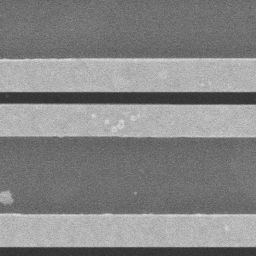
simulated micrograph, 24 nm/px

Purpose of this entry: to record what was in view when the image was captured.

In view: lines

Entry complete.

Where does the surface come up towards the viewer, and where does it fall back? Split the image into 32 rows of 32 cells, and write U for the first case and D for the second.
DDDDDDDDDDDDDDDDDDDDDDDDDDDDDDDD
DDDDDDDDDDDDDDDDDDDDDDDDDDDDDDDD
DDDDDDDDDDDDDDDDDDDDDDDDDDDDDDDD
DDDDDDDDDDDDDDDDDDDDDDDDDDDDDDDD
DDDDDDDDDDDDDDDDDDDDDDDDDDDDDDDD
DDDDDDDDDDDDDDDDDDDDDDDDDDDDDDDD
DDDDDDDDDDDDDDDDDDDDDDDDDDDDDDDD
DDDDUUUDUUUUUUUUUUUUUUUUUUUUUUUU
UUUUUUUUUUUUUUUUUUUUUUUUUUUUUUUU
UUUUUUUUUUUUUUUUUUUUUUUUUUUUUUUU
UUUUUUUUUUUUUUUUUUUUUUUUUUUUUUUU
DDDDDDDDDDDDDDDDDDDDDDDDDDDDDDDD
DDDDDDDDDDDDDDDDDDDDDDDDDDDDDDDD
UUUUUUUUUUUUUUUUUUUUUUUUUUUUUUUU
UUUUUUUUUUUUUUUUUUUUUUUUUUUUUUUU
UUUUUUUUUUUUUUUUUUUUUUUUUUUUUUUU
UUUUUUUUUUUUUUUUUUUUUUUUUUUUUUUU
DDDDDDDDDDDDDDDDDDDDDDDDDDDDDDDD
DDDDDDDDDDDDDDDDDDDDDDDDDDDDDDDD
DDDDDDDDDDDDDDDDDDDDDDDDDDDDDDDD
DDDDDDDDDDDDDDDDDDDDDDDDDDDDDDDD
DDDDDDDDDDDDDDDDDDDDDDDDDDDDDDDD
DDDDDDDDDDDDDDDDDDDDDDDDDDDDDDDD
DDDDDDDDDDDDDDDDDDDDDDDDDDDDDDDD
DDDDDDDDDDDDDDDDDDDDDDDDDDDDDDDD
DDDDDDDDDDDDDDDDDDDDDDDDDDDDDDDD
DDDDDDDDDDDDDDDDDDDDDDDDDDDDDDDD
UUUUUUUUUUUUUUUUUUUUUUUUUUUUUUUU
UUUUUUUUUUUUUUUUUUUUUUUUUUUUUUUU
UUUUUUUUUUUUUUUUUUUUUUUUUUUUUUUU
UUUUUUUUUUUUUUUUUUUUUUUUUUUUUUUU
DDDDDDDDDDDDDDDDDDDDDDDDDDDDDDDD